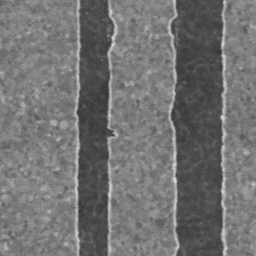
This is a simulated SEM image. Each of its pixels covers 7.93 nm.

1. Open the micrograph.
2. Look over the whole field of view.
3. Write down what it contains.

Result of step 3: one or a few lines or trenches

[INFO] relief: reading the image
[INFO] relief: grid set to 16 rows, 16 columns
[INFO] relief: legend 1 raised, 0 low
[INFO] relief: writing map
1111100111100011
1111100111100011
1111100111100011
1111100111100011
1111100111100011
1111100111100011
1111100111100011
1111100111100011
1111100111100011
1111100111100011
1111100111100011
1111100111100011
1111100111100011
1111100111100011
1111100111100011
1111100111100011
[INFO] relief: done